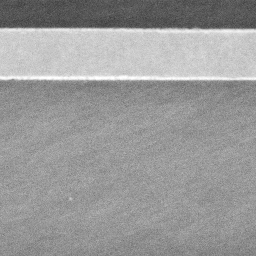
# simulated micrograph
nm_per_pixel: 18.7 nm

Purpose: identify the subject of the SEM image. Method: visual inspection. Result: lines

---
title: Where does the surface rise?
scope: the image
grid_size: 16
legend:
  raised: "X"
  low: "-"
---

----------------
----------------
XXXXXXXXXXXXXXXX
XXXXXXXXXXXXXXXX
XXXXXXXXXXXXXXXX
----------------
----------------
----------------
----------------
----------------
----------------
----------------
----------------
----------------
----------------
----------------